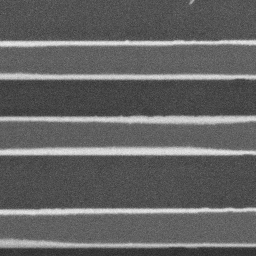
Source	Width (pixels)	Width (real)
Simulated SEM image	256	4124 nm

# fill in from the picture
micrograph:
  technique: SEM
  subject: lines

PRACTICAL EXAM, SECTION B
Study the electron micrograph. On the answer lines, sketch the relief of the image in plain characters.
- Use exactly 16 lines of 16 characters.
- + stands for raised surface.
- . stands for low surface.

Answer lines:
................
................
................
++++++++++++++++
++++++++++++++++
................
................
++++++++++++++++
++++++++++++++++
++++++++++++++++
................
................
................
++++++++++++++++
++++++++++++++++
................